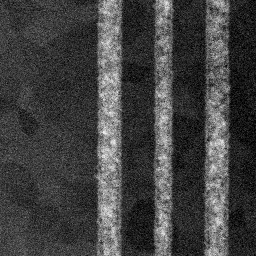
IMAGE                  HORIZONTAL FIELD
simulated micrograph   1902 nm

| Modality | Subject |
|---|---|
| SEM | parallel lines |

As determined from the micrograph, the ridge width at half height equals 266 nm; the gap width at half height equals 0.147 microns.